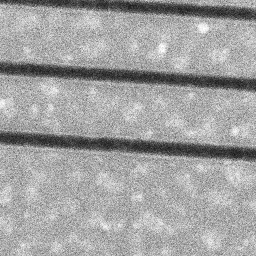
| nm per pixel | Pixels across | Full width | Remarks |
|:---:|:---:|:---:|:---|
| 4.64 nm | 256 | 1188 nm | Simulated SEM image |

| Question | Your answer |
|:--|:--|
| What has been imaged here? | one or a few lines or trenches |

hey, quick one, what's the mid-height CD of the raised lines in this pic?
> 0.0816 um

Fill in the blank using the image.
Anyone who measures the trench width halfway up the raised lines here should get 246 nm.